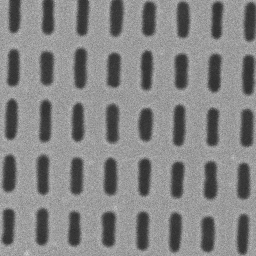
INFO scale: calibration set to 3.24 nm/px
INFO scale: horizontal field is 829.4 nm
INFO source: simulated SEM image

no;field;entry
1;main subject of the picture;a regular array of holes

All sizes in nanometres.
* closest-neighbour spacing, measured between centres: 108